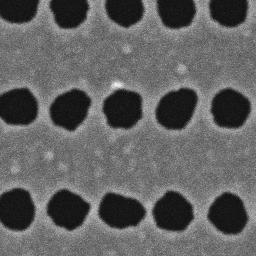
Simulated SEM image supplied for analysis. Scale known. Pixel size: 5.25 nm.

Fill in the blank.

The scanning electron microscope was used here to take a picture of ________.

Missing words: a regular array of holes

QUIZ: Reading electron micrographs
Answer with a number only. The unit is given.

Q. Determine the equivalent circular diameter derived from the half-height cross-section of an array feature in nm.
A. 215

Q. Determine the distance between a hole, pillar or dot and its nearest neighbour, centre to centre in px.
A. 53